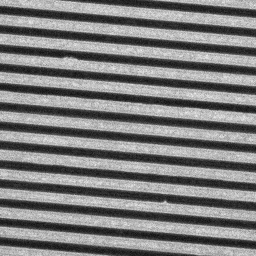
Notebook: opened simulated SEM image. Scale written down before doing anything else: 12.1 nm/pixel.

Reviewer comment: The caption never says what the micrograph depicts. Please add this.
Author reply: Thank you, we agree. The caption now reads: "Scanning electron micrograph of parallel lines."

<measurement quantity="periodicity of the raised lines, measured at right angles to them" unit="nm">232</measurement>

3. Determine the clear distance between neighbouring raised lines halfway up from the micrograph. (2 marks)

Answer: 93.3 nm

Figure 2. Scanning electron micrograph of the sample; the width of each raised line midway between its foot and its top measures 140 nm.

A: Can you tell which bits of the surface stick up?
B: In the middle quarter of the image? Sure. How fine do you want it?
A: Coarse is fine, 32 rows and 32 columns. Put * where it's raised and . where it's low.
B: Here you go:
*********************...........
..******************************
.............*******************
*.......................********
************....................
***********************.........
....****************************
...............*****************
**........................******
*************...................
*************************.......
.....***************************
................****************
****........................****
***************.................
**************************......
.......*************************
..................**************
******.......................***
*****************...............
****************************....
...........*********************
......................**********
*******.........................
******************..............
..***************************...
.............*******************
........................********
*********.......................
********************............
....***************************.
...............*****************